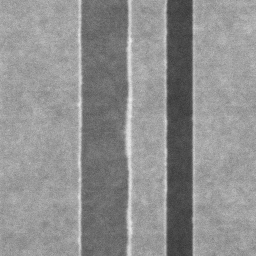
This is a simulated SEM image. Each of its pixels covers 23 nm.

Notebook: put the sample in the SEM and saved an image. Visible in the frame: lines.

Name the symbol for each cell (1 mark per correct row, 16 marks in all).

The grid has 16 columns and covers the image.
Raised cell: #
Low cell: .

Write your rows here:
#####...##..####
#####...##..####
#####...##..####
#####...##..####
#####...##..####
#####...##..####
#####...##..####
#####...##..####
#####...##..####
#####...##..####
#####...##..####
#####...##..####
#####...##..####
#####...##..####
#####...##..####
#####...##..####